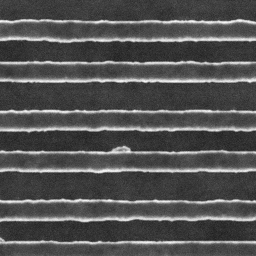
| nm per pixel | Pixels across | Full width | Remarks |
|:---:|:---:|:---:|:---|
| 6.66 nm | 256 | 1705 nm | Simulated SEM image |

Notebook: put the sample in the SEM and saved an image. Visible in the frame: lines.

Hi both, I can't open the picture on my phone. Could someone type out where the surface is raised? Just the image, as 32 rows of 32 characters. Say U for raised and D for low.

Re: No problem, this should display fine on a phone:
DDDDDDDDDDDDDDDDDDDDDDDDDDDDDDDD
DDDDDDDDDDDDDDDDDDDDDDDDDDDDDDDD
DDDDDDDDDDDDDDDDDDDDDDDDDDDDDDDD
UUUUUUUUUUUUUUUUUUUUUUUUUUUUUUUU
UUUUUUUUUUUUUUUUUUUUUUUUUUUUUUUU
DDDDDDDDDDDDDDDDDDDDDDDDDDDDDDDD
DDDDDDDDDDDDDDDDDDDDDDDDDDDDDDDD
DDDDDDDDDDDDDDDDDDDDDDDDDDDDDDDD
UUUUUUUUUUUUUUUUUUUUUUUUUUUUUUUU
UUUUUUUUUUUUUUUUUUUUUUUUUUUUUUUU
DDDDDDDDDDDDDDDDDDDDDDDDDDDDDDDD
DDDDDDDDDDDDDDDDDDDDDDDDDDDDDDDD
DDDDDDDDDDDDDDDDDDDDDDDDDDDDDDDD
DDDDDDDDDDDDDDDDDDDDDDDDDDDDDDDD
UUUUUUUUUUUUUUUUUUUUUUUUUUUUUUUU
UUUUUUUUUUUUUUUUUUUUUUUUUUUUUUUU
DDDDDDDDDDDDDDDDDDDDDDDDDDDDDDDD
DDDDDDDDDDDDDDDDDDDDDDDDDDDDDDDD
DDDDDDDDDDDDDDDDDDDDDDDDDDDDDDDD
UUUUUUUUUUUUUUUUUUUUUUUUUUUUUUUU
UUUUUUUUUUUUUUUUUUUUUUUUUUUUUUUU
DDDDDDDDDDDDDDDDDDDDDDDDDDDDDDDD
DDDDDDDDDDDDDDDDDDDDDDDDDDDDDDDD
DDDDDDDDDDDDDDDDDDDDDDDDDDDDDDDD
DDDDDDDDDDDDDDDDDDDDDDDDDDDDDDDD
UUUUUUUUUUUUUUUUUUUUUUUUUUUUUUUU
UUUUUUUUUUUUUUUUUUUUUUUUUUUUUUUU
UUDUUUUUDUUUUDDUDDDDDDDUUDDDDUUU
DDDDDDDDDDDDDDDDDDDDDDDDDDDDDDDD
DDDDDDDDDDDDDDDDDDDDDDDDDDDDDDDD
UUUUUUUUUUUUUUUUUUUUUUUUUUUUUUUU
UUUUUUUUUUUUUUUUUUUUUUUUUUUUUUUU